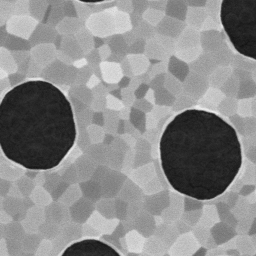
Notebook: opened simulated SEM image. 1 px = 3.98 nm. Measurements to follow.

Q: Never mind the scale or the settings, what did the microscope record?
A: holes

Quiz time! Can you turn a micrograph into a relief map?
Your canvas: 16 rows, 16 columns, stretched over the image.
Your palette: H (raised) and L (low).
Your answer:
HHHHHHHHHHHHHHLL
HHHHHHHHHHHHHHLL
HHHHHHHHHHHHHHLL
HHHHHHHHHHHHHHHL
HHHHHHHHHHHHHHHH
HLLLHHHHHHHHHHHH
LLLLHHHHHHHHHHHH
LLLLLHHHHHHLLLHH
LLLLLHHHHHLLLLLH
LLLLHHHHHHLLLLLH
HHLHHHHHHHLLLLLH
HHHHHHHHHHHLLLHH
HHHHHHHHHHHHHHHH
HHHHHHHHHHHHHHHH
HHHHHHHHHHHHHHHH
HHHHLLLHHHHHHHHH